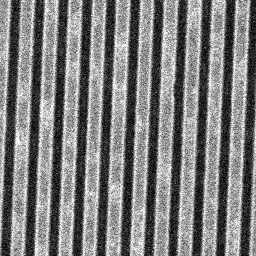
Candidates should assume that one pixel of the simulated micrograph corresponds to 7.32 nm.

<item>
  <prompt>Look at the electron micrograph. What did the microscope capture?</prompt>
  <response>parallel lines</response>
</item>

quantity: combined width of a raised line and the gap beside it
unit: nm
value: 175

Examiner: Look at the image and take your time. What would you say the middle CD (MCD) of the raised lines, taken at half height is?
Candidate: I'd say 97.8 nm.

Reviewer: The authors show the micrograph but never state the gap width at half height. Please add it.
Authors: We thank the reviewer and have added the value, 76.8 nm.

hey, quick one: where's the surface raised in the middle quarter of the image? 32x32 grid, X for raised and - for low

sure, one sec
-XXX---XXX--XXXX---XXX--XXXX---X
-XXX--XXXX--XXXX---XXX--XXXX--XX
XXXX---XXX--XXXX---XXX--XXXX--XX
XXXX--XXXX--XXXX---XXX--XXXX--XX
XXXX--XXX---XXXX---XXX--XXXX--XX
XXX---XXXX--XXXX--XXXX--XXX---XX
XXX---XXXX--XXXX--XXXX--XXX---XX
XXX---XXXX--XXXX--XXX---XXX---XX
XXX---XXXX--XXX---XXX---XXX---XX
XXX---XXX---XXX---XXX---XXX---XX
XXX---XXX---XXX---XXX---XXX---XX
XXX---XXX---XXX---XXX---XXX---XX
XXX---XXX---XXX---XXX---XXX---XX
XXX---XXX---XXX---XXX---XXX---XX
XXX---XXX---XXX---XXX---XXX---XX
XXX---XXX---XXX---XXX---XXX---XX
XXX---XXX---XXX---XXX---XXX---XX
XXX---XXX---XXX---XXX---XXX---XX
XXX---XXX---XXX---XXX---XXX---XX
XXX---XXX---XXX---XXX---XXX---XX
XXX---XXX---XXX---XXX---XXX---XX
XXX---XXX---XXX---XXX---XXX---XX
XXX---XXX---XXX---XXX---XXX---XX
XXX---XXX---XXX---XXX--XXXX---XX
XXX---XXX--XXXX---XXX--XXXX---XX
XXX---XXX--XXXX---XXX--XXXX---XX
XXX--XXXX--XXXX---XXX--XXXX---XX
XXX--XXXX--XXXX---XXX--XXXX--XXX
XXX--XXX---XXXX---XXX--XXXX--XXX
XXX--XXXX--XXXX--XXXX--XXXX--XXX
XXX--XXXX--XXXX--XXXX--XXXX--XXX
XXX--XXXX--XXXX--XXXX--XXX---XXX